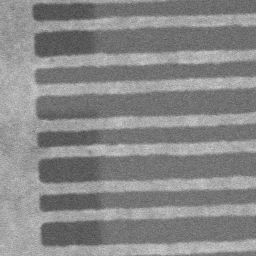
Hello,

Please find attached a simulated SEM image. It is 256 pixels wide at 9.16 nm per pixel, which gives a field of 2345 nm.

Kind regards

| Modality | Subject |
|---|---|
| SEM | parallel lines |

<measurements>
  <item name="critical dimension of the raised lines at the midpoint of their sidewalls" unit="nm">91.5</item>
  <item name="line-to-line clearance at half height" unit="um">0.223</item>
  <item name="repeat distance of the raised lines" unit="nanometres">295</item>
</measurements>